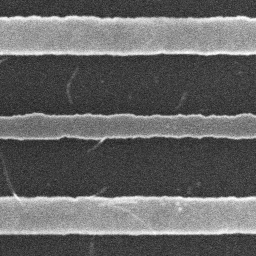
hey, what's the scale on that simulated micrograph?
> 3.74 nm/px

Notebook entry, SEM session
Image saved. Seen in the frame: lines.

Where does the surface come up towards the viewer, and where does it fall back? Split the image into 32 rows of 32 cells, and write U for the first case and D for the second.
DDDDDDDDDDDDDDDDDDDDDDDDDDDDDDDD
DDDDDDDDDDDDDDDDDDDDDDDDDDDDDDDD
UUUUUUUUUUUUUUUUUUUUUUUUUUUUUUUU
UUUUUUUUUUUUUUUUUUUUUUUUUUUUUUUU
UUUUUUUUUUUUUUUUUUUUUUUUUUUUUUUU
UUUUUUUUUUUUUUUUUUUUUUUUUUUUUUUU
UUUUUUUUUUUUUUUUUUUUUUUUUUUUUUUU
DDDDDDDDDDDDDDDDDDDDDDDDDDDDDDDD
DDDDDDDDDDDDDDDDDDDDDDDDDDDDDDDD
DDDDDDDDDDDDDDDDDDDDDDDDDDDDDDDD
DDDDDDDDDDDDDDDDDDDDDDDDDDDDDDDD
DDDDDDDDDDDDDDDDDDDDDDDDDDDDDDDD
DDDDDDDDDDDDDDDDDDDDDDDDDDDDDDDD
DDDDDDDDDDDDDDDDDDDDDDDDDDDDDDDD
DDUUUUUDUUUUUUUUUDDUDDUUUDUDDUUU
UUUUUUUUUUUUUUUUUUUUUUUUUUUUUUUU
UUUUUUUUUUUUUUUUUUUUUUUUUUUUUUUU
DDDDDDDDDDDDDDDDDDDDDDDDDDDDDDDD
DDDDDDDDDDDDDDDDDDDDDDDDDDDDDDDD
DDDDDDDDDDDDDDDDDDDDDDDDDDDDDDDD
DDDDDDDDDDDDDDDDDDDDDDDDDDDDDDDD
DDDDDDDDDDDDDDDDDDDDDDDDDDDDDDDD
DDDDDDDDDDDDDDDDDDDDDDDDDDDDDDDD
DDDDDDDDDDDDDDDDDDDDDDDDDDDDDDDD
DDDDDDDDDDDDDDDDDDDDDDDDDDDDDDDD
UUUUUUUUUUUUUUUUUUUUUUUUUUUUUUUU
UUUUUUUUUUUUUUUUUUUUUUUUUUUUUUUU
UUUUUUUUUUUUUUUUUUUUUUUUUUUUUUUU
UUUUUUUUUUUUUUUUUUUUUUUUUUUUUUUU
DDDDDDDDDDDDDDDDDDDDDDDDDDDDDDDD
DDDDDDDDDDDDDDDDDDDDDDDDDDDDDDDD
DDDDDDDDDDDDDDDDDDDDDDDDDDDDDDDD